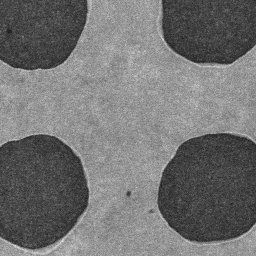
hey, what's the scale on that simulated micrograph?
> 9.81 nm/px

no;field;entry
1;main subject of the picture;holes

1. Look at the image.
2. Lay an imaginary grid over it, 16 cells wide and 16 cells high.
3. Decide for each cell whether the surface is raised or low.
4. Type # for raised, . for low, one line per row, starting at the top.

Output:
.....#####......
.....#####......
.....#####......
....#######....#
################
################
################
################
##.##########..#
.....######.....
.....#####......
.....#####......
......####......
.....#####......
....#######....#
#..#############